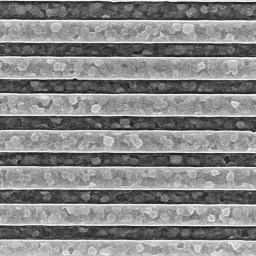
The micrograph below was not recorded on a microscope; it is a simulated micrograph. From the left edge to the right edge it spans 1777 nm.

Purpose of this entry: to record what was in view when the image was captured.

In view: parallel lines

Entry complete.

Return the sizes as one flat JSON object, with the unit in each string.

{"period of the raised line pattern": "254 nm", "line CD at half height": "152 nm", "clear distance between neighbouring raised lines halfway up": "103 nm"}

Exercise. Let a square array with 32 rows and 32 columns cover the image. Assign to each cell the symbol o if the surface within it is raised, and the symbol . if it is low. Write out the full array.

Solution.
................................
................................
................................
oooooooooooooooooooooooooooooooo
oooooooooooooooooooooooooooooooo
................................
................................
oooooooooooooooooooooooooooooooo
oooooooooooooooooooooooooooooooo
oooooooooooooooooooooooooooooooo
................................
................................
oooooooooooooooooooooooooooooooo
oooooooooooooooooooooooooooooooo
............................oooo
................................
ooooooooooooooooooooooooooooooo.
oooooooooooooooooooooooooooooooo
oooooooooooooooooooooooooooooooo
................................
................................
oooooooooooooooooooooooooooooooo
oooooooooooooooooooooooooooooooo
oooooooooooooooooooooooooooooooo
................................
................................
oooooooooooooooooooooooooooooooo
oooooooooooooooooooooooooooooooo
................................
................................
oooooooooooooooooooooooooooooooo
oooooooooooooooooooooooooooooooo